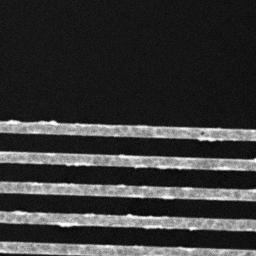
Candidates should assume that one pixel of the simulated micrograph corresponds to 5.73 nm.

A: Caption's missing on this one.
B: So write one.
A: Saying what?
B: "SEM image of parallel lines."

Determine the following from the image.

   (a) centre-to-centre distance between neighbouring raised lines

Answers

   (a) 172 nm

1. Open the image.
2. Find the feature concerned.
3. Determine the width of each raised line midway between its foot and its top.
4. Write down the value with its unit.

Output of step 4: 10.8 px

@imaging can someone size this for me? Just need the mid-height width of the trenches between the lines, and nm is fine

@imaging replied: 112